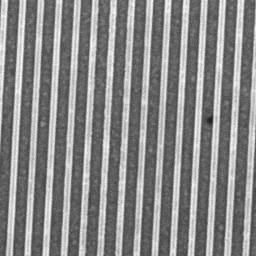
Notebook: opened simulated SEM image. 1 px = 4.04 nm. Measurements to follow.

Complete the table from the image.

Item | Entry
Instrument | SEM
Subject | parallel lines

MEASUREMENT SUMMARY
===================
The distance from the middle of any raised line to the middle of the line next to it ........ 18.1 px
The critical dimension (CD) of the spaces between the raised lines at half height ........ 50.9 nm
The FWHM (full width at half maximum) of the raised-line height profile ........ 21.7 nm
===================